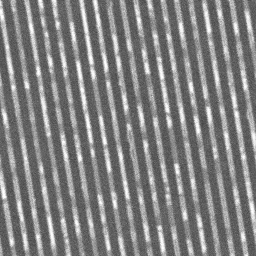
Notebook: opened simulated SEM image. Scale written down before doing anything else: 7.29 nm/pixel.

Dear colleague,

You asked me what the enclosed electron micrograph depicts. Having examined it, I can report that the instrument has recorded parallel lines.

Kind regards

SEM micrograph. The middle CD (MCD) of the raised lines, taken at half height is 0.0278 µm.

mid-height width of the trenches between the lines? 70.1 nm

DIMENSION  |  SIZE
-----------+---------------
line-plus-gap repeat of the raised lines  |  0.0982 µm